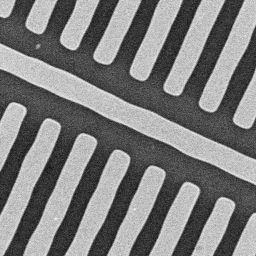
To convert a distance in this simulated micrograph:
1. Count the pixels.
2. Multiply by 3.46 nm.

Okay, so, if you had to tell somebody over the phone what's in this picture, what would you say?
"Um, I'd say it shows groups of lines, slits or small figures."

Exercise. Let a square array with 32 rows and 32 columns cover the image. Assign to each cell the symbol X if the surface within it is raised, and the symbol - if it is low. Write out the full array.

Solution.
XX--XXX--XXX---XX---XXX--XXX--XX
X---XX---XXX--XXX--XXX---XX---XX
---XXX---XX---XX---XXX--XXX--XXX
----XX--XXX--XXX---XX---XX---XXX
--------XX---XXX--XXX--XXX---XX-
--------XX--XXX---XX---XXX--XXX-
XX----------XXX--XXX--XXX---XXX-
XXXXX-------XX---XX---XXX--XXX--
XXXXXXX---------XXX---XX---XX---
--XXXXXXX--------XX--XXX--XXX---
----XXXXXXX----------XX---XXX--X
-------XXXXXX--------XX--XXX---X
---------XXXXXX----------XXX--XX
-XX--------XXXXXXX-------XX---XX
XXX----------XXXXXXX---------XXX
XXX--XX--------XXXXXXX--------XX
XX---XX-----------XXXXXX--------
XX--XXX--XXX--------XXXXXX------
X---XXX--XXX----------XXXXXXX---
X--XXX---XX---XX--------XXXXXXX-
---XXX--XXX--XXX-----------XXXXX
--XXX---XX---XXX--XXX-------XXXX
--XXX--XXX---XX---XX-----------X
--XX---XX---XXX--XXX---XX-------
-XXX--XXX---XX---XXX--XXX-------
-XX---XXX--XXX--XXX---XX---XX---
XXX--XXX---XXX--XXX--XXX---XX---
XX---XXX--XXX--XXX---XX---XXX--X
XX---XX---XXX--XXX--XXX--XXX---X
XX--XXX--XXX---XX---XXX--XXX--XX
X---XX---XX---XXX--XXX---XX---XX
X--XXX--XXX---XX---XXX--XXX--XXX